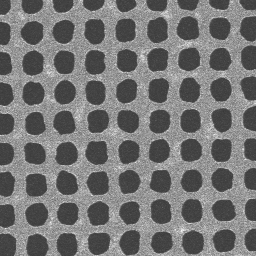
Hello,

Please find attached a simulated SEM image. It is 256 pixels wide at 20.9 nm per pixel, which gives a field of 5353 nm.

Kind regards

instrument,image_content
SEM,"a regular array of holes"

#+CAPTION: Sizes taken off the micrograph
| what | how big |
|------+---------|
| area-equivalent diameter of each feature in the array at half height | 486 nm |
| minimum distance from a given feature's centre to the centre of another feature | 627 nanometers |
